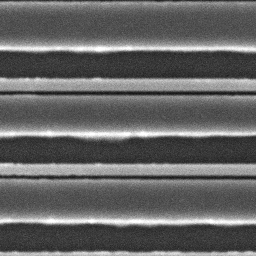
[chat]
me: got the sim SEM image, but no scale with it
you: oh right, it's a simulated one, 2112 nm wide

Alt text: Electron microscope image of lines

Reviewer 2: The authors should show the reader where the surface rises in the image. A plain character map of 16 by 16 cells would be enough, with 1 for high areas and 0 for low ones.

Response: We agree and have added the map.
1111111111111111
1111111111111111
1111111111111111
0000000000000000
0000000000000000
1111111111111111
1111111111111111
1111111111111111
0000000000000000
0000000000000000
1111111111111111
1111111111111111
1111111111111111
1111111111111111
0000000000000000
0000000000000000